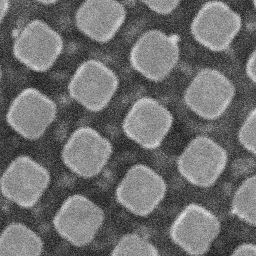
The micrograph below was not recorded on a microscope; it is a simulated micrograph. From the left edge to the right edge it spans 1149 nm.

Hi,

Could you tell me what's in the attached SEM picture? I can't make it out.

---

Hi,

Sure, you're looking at a regular array of raised bodies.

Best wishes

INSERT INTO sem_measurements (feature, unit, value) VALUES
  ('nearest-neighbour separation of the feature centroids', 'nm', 300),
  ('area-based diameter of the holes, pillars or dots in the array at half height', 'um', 0.203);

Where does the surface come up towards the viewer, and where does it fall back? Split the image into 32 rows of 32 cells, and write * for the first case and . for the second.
*..........****...****....**....
*.........*****.....*....****...
..........*****.........******..
...***....*****.........******..
..*****....***....**....*****...
..******.........*****....***...
..*****..........*****..........
...****.........******.........*
....**....***....****..........*
.........*****....***....***...*
.........******.........*****...
...**....*****.........******...
..****....***.....*....******...
.******....**....***....****....
.******.........*****....**....*
.*****..........*****..........*
..***.....**....*****.........**
.........****....***....**....**
........******.........****....*
........******.........*****....
..**....*****.........******....
.*****....**....***....****.....
******.........*****....***....*
******.........******.........**
.****....*.....*****.........***
..**....****...*****.........***
........*****....**....***....**
.......******.........*****....*
.**....*****..........*****.....
****....****....*.....*****.....
*****....**....****...****......
*****.........******....*....***